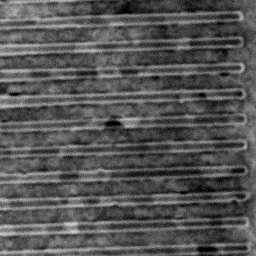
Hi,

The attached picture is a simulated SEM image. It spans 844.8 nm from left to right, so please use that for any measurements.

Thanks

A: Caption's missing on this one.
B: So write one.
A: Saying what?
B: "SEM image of parallel lines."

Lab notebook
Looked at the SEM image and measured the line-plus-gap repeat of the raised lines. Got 0.0849 um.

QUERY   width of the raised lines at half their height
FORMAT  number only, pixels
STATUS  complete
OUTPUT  8.61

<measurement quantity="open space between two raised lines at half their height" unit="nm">57.2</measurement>